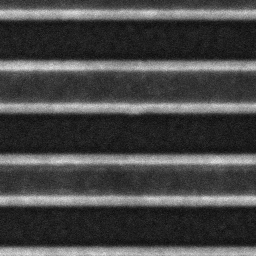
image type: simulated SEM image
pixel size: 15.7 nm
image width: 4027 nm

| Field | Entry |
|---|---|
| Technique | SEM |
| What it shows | one or a few lines or trenches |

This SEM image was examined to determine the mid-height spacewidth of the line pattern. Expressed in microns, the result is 0.787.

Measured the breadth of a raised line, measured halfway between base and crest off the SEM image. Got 674 nm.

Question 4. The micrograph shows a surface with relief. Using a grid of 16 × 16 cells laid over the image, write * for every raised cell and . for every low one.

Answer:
****************
................
................
................
****************
****************
****************
................
................
................
****************
****************
****************
................
................
................